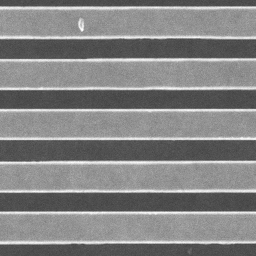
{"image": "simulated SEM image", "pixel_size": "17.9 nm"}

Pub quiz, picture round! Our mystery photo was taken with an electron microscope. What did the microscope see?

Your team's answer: lines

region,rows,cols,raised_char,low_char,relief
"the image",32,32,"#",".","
................................
################################
################################
################################
################################
................................
................................
################################
################################
################################
################################
................................
................................
................................
################################
################################
################################
................................
................................
................................
################################
################################
################################
################################
................................
................................
................................
################################
################################
################################
................................
................................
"